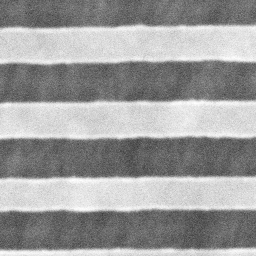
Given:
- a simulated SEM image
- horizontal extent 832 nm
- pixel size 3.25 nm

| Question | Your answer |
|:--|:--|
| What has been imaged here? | lines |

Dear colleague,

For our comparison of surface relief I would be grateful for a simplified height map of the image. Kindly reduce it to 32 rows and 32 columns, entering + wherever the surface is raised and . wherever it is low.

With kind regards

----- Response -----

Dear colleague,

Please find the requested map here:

................................
................................
................................
..............++++++++++++++++++
++++++++++++++++++++++++++++++++
++++++++++++++++++++++++++++++++
++++++++++++++++++++++++++++++++
++++++++++++++++..+++.........++
................................
................................
................................
................................
................................
++++++++++++++++++++++++++++++++
++++++++++++++++++++++++++++++++
++++++++++++++++++++++++++++++++
++++++++++++++++++++++++++++++++
................................
................................
................................
................................
................................
.+....++++++++++++++++++++++++++
++++++++++++++++++++++++++++++++
++++++++++++++++++++++++++++++++
++++++++++++++++++++++++++++++++
................................
................................
................................
................................
................................
++++++++++++++++++++++++++++++++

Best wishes